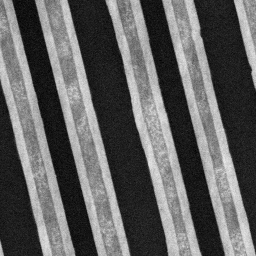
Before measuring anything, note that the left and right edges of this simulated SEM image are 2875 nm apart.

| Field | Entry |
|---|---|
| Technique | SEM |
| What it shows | one or a few lines or trenches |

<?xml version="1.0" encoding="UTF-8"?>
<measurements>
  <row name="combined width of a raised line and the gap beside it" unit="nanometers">665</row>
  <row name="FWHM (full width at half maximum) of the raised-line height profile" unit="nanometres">238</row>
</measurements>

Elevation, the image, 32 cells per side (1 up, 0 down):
10000111000000111000011100000011
10000111000000111000011100000011
11000011000000011000011100000011
11000011100000011100001100000001
11000011100000011100001110000001
11000011100000011100001110000001
11100001100000001100001110000001
11100001110000001110000110000000
11100001110000001110000111000000
01100001110000001110000111000000
01110000110000001110000011000000
01110000111000000111000011000000
01110000111000000111000011000000
00110000111000000111000011100000
00111000011000000111000011100000
00111000011100000011100001100000
00111000011100000011100001100000
00011000011100000011100001110000
00011000001100000001100001110000
00011100001110000001110000110000
00011100001110000001110000110000
00001100001110000001110000111000
00001100000110000000110000111000
00001110000111000000110000011000
00001110000111000000111000011100
00000110000111000000111000011100
00000110000111000000011000011100
00000111000011100000011000001100
00000111000011100000011100001110
00000011000011100000011100001110
00000011000011100000001100001110
00000011100001110000001100000110